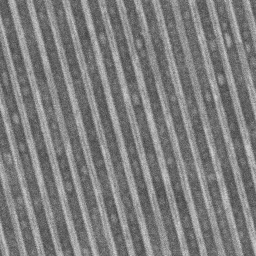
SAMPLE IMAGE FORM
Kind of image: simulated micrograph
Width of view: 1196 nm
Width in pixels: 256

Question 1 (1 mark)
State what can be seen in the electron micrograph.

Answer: parallel lines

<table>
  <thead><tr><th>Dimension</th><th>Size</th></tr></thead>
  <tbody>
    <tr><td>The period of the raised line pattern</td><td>81.5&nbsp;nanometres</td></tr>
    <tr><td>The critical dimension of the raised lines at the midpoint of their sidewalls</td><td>27.7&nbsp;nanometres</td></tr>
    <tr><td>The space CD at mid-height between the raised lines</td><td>11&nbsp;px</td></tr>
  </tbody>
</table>